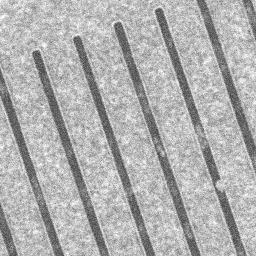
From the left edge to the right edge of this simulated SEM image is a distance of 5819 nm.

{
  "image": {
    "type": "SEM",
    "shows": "parallel lines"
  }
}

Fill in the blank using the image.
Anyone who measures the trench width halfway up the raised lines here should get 234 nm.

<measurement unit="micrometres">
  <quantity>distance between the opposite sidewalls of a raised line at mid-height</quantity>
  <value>0.758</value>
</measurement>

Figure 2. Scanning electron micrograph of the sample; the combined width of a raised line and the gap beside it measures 984 nanometres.